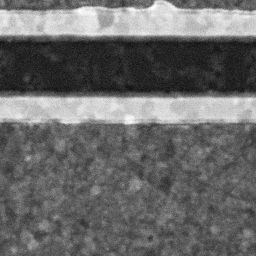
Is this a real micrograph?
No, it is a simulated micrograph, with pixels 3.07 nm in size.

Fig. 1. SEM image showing one or a few lines or trenches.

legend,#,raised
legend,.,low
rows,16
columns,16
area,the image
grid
################
################
................
................
................
................
................
################
################
################
################
################
################
################
################
################